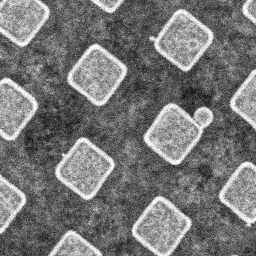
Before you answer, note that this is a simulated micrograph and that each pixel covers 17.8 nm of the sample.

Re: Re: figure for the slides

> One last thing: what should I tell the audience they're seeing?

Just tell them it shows raised bodies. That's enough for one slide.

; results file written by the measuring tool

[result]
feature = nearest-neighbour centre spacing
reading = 1660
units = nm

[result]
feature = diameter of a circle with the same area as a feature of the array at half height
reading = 0.878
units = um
